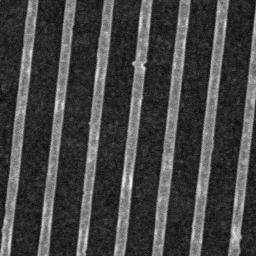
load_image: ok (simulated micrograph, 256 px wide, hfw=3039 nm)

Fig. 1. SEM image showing parallel lines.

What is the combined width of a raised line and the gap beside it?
0.449 um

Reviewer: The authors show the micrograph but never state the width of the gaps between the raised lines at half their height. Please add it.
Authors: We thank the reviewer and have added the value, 335 nm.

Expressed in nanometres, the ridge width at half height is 121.